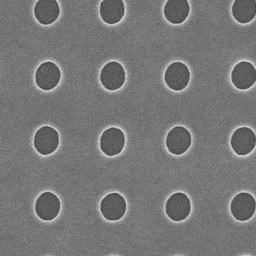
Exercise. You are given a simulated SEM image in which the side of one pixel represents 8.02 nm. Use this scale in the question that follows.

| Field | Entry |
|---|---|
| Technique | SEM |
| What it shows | a regular array of holes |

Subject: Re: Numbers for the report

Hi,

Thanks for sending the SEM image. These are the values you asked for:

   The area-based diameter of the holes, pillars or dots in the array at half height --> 215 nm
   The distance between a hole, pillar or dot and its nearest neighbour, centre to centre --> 519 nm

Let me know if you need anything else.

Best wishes